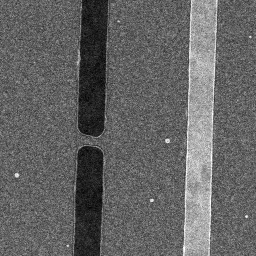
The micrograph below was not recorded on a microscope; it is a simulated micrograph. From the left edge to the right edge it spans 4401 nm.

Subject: one or a few lines or trenches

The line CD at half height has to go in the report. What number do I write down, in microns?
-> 0.445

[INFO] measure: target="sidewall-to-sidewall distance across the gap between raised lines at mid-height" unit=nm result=1420